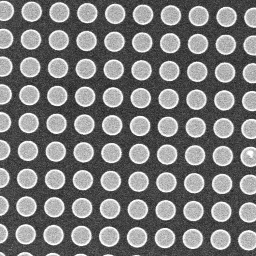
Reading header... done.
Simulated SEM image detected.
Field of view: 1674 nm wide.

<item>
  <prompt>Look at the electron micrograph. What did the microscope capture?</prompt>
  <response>an array of small figures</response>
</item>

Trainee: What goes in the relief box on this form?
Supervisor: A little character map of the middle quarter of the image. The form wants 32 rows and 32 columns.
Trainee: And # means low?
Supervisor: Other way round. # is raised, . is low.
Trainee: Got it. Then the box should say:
#..#####..#####..#####..####...#
#..#####..#####..#####..#####..#
...####...#####..#####..#####..#
.....#.....###....###....###...#
................................
................................
....###....###....###....##.....
#..#####..####...####...####...#
#..#####..#####..#####..#####..#
...####...####...####...####...#
....##.....##.....###...####...#
................................
................................
...####...####....##.....##.....
...####...####...####...####...#
...####...####...####...####...#
...####...####...####...####...#
....##.....##.....##....###....#
................................
................................
...####...####...###.....##.....
..#####..#####..#####...####...#
..#####..#####..#####..#####..##
...####...####...####..#####..##
....#......##.....##....###....#
................................
................................
...####...###....###....###.....
..#####..#####..#####...####...#
..#####..#####..#####..#####..##
...####..#####..#####..#####..##
...........##.....##....###....#